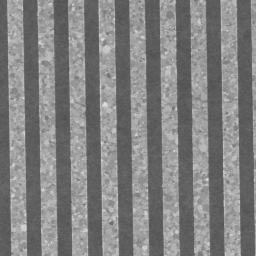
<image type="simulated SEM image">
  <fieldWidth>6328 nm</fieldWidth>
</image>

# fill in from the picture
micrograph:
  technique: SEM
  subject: parallel lines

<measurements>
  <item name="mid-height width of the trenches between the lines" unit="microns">0.38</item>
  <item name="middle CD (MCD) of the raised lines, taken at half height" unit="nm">380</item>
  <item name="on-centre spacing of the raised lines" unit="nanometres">754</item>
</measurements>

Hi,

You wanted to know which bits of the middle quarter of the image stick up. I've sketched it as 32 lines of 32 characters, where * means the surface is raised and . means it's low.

..***....****....***....****....
..***....****....***....****....
..***....****....***....****....
..***....****....***....****....
..***....****....***....****....
..***....****....***....****....
..***....****....***....****....
..***....****....***....****....
..***....****....***....****....
..***....****....***....****....
..***....****....****...****....
..***....****....****....***....
..***....****....****....***....
..***....****....****....***....
..***....****....****....***....
..***....****....****....***....
..***....****....****....***....
..***....****....****....***....
..***....****....****....***....
..***....****....****....***....
..***....****....****....***....
..***....****....****....***....
..***....****....****....***....
..***.....***....****....***....
..***.....***....****....***....
..***.....***....****....***....
..***.....***....****....***....
..***.....***....****....***....
..***.....***....****....***....
..****....***....****....***....
..****....***....****....***....
..****....***....****....***....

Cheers